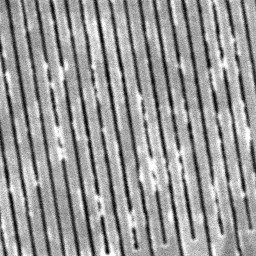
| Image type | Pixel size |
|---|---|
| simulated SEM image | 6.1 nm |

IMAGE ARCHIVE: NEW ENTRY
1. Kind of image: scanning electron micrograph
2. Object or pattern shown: parallel lines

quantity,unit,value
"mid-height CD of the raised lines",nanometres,63.2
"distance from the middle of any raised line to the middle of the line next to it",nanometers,88.4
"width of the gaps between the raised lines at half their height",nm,28.6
